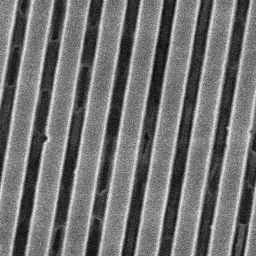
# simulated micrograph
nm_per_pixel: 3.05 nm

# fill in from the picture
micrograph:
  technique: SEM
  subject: parallel lines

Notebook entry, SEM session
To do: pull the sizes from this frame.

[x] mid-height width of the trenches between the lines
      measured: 42 nanometres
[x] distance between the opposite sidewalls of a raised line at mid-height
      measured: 66.1 nanometres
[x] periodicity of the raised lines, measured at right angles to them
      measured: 109 nm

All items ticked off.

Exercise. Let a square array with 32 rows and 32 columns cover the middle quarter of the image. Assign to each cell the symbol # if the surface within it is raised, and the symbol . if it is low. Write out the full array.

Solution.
####....#####....#####....#####.
####...######...######...######.
###....######...######...######.
###....#####....######...######.
###....#####....#####....#####..
###...######....#####....#####..
###...######....#####....#####..
###...######...######....#####..
###...######...######...######..
##....#####....#####....######..
##....#####....#####....#####...
##...######....#####....#####...
##...######....#####....#####...
##...######...######....#####...
#....######...######...######...
#....#####....#####....######...
#....#####....#####....#####....
#...######....#####....#####....
#...######....#####....#####....
#...######...######...######....
#...######...######...######...#
....#####....#####....######...#
....#####....#####....#####....#
...######....#####....#####....#
...######....#####....#####....#
...######...######....#####....#
...######...######...######...##
...#####....######...######...##
...#####....######...#####....##
..######....#####....#####....##
..######....#####....#####....##
..######...######...######....##